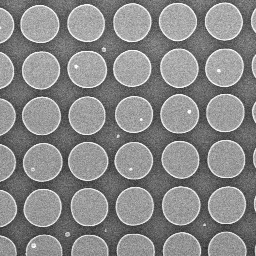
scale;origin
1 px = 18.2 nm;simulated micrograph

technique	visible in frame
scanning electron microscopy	an array of small figures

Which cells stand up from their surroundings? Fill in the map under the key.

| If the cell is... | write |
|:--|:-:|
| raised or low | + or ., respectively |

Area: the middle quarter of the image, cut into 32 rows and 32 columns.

.++++++++++.++++++++++..++++++++
.++++++++++.++++++++++..++++++++
.++++++++++..+++++++++..++++++++
..++++++++...++++++++....+++++++
..++++++++....++++++......++++++
....++++........++.........+++..
................................
................................
....+++........++++.......+++++.
...++++++.....+++++++....+++++++
..++++++++...+++++++++...+++++++
.+++++++++...+++++++++..++++++++
.+++++++++...+++++++++..++++++++
.+++++++++...+++++++++..++++++++
.+++++++++...+++++++++..++++++++
..++++++++....+++++++....+++++++
...++++++......+++++......++++++
....+++.........................
................................
.....+......................++..
...++++++......+++++......++++++
..++++++++....+++++++....+++++++
.++++++++++..+++++++++...+++++++
.++++++++++..+++++++++..++++++++
.++++++++++..+++++++++..++++++++
.++++++++++..+++++++++...+++++++
..++++++++...+++++++++...+++++++
..++++++++....+++++++.....++++++
...+++++........+++.........+++.
................................
................................
....++++.......+++++......++++++